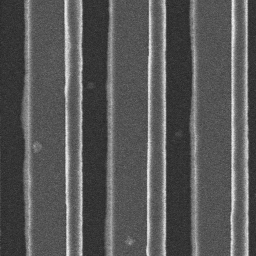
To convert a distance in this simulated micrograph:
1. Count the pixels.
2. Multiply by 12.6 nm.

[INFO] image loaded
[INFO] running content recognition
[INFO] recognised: lines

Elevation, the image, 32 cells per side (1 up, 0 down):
00001111110000111111100011111110
00001111110000111111100011111110
00001111110000111111100011111110
00001111110000111111100011111110
00001111110000111111100011111110
00001111110000111111100011111110
00001111110000111111100011111110
00001111110000111111100011111110
00001111110000111111100011111110
00001111110000111111100011111110
00001111110000111111100011111110
00001111110000111111100011111110
00001111110000111111100011111110
00001111110000111111100011111110
00001111110000111111100011111110
00001111110000111111100011111110
00001111110000111111100011111110
00001111110000111111100011111110
00001111110000111111100011111110
00001111110000111111100011111110
00001111110000111111100011111110
00001111110000111111100011111110
00001111110000111111100011111110
00001111110000111111100011111110
00001111110000111111100011111110
00001111110000111111100011111110
00001111110000111111100011111110
00001111110000111111100011111110
00001111110000111111100001111110
00001111110000111111100001111110
00001111110000111111100001111110
00001111110000111111100001111110